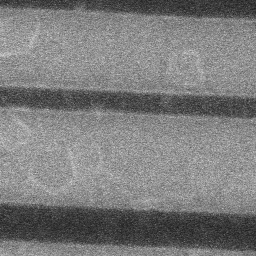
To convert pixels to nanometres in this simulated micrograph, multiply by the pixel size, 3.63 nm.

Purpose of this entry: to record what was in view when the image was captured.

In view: one or a few lines or trenches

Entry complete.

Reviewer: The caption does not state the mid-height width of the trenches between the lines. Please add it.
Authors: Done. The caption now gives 303 nanometres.